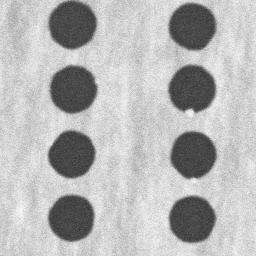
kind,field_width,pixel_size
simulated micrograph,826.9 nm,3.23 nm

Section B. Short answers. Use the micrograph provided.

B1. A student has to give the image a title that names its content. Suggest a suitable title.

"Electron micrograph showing a regular array of holes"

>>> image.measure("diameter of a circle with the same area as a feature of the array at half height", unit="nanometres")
151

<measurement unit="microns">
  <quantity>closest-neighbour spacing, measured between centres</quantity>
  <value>0.207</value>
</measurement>